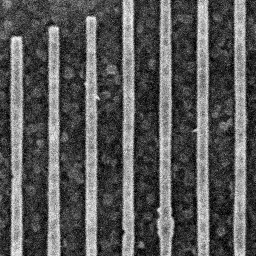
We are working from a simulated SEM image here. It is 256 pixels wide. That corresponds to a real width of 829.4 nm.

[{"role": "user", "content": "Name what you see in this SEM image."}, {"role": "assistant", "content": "parallel lines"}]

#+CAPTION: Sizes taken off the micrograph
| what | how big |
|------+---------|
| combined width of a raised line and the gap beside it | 120 nm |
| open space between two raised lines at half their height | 90.7 nm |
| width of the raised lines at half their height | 31.2 nm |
